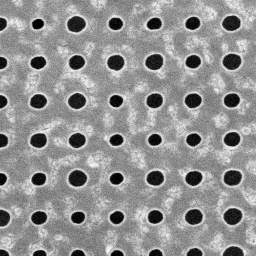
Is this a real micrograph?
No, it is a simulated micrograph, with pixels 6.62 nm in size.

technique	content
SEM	a regular array of holes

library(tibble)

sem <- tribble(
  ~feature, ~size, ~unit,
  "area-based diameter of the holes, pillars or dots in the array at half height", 0.102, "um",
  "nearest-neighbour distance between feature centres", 38.4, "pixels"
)